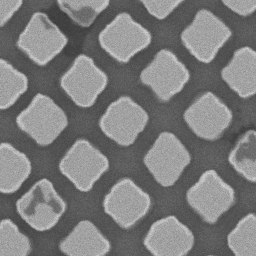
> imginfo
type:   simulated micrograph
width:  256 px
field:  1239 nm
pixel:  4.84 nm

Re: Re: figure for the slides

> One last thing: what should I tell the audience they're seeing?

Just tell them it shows a regular array of raised bodies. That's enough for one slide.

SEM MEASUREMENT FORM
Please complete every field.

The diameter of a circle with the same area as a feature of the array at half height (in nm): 224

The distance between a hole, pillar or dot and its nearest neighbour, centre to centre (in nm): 279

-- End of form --